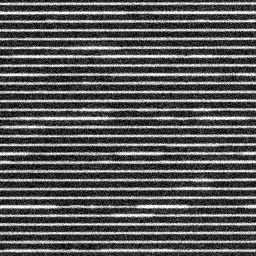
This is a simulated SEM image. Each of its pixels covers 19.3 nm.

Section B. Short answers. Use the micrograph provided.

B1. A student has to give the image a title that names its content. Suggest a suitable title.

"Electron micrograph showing parallel lines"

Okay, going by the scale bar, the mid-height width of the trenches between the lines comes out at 133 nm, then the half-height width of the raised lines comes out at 33.8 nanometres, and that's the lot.